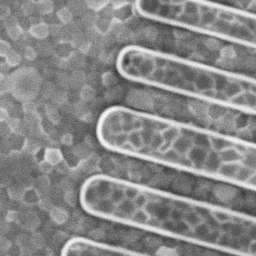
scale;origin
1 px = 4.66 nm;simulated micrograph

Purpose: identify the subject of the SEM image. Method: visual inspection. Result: one or a few lines or trenches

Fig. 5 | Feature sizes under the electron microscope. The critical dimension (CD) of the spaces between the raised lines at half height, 32.9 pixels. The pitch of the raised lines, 314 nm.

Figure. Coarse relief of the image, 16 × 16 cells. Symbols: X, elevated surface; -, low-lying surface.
---------XXXXX--
-----------XXXXX
---------------X
--------XX------
--------XXXXXX--
-----------XXXXX
--------------XX
------XXXX------
------XXXXXXXX--
--------XXXXXXXX
-----------XXXXX
-----XXX-------X
-----XXXXXXX----
-------XXXXXXXX-
----------XXXXXX
----XXX-------XX